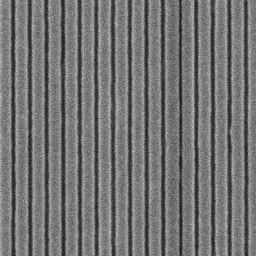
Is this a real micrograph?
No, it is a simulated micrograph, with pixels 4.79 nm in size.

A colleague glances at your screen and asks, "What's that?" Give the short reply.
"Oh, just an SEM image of parallel lines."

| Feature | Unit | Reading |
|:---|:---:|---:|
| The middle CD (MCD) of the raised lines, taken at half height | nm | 56.3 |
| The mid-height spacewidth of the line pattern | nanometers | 21.6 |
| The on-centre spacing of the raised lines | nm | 79.7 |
